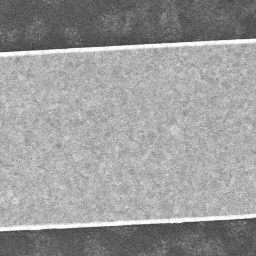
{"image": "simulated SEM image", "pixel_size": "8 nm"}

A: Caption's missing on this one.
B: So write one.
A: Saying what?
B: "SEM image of one or a few lines or trenches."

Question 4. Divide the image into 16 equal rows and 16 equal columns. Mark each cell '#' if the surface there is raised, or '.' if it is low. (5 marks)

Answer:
................
................
................
################
################
################
################
################
################
################
################
################
################
################
................
................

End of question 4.